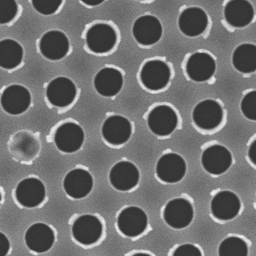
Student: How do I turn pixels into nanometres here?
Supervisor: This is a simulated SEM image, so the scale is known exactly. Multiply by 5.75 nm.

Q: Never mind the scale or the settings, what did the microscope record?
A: a regular array of holes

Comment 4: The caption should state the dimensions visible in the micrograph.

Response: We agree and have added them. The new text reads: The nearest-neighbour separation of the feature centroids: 0.264 micrometres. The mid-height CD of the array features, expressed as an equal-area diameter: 170 nanometres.